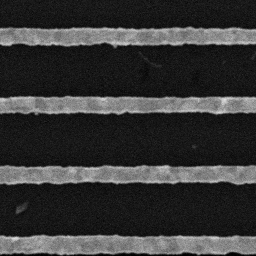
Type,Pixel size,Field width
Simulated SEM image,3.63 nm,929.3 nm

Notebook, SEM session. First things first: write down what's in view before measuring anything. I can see lines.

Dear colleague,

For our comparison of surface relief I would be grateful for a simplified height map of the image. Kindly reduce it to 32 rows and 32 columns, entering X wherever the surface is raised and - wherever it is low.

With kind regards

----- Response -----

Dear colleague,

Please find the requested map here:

--------------------------------
--------------------------------
--------------------------------
--------------------------------
XXXXXXXXXXXXXXXXXXXXXXXXXXXXXXXX
XX-XXXXXXXXX--XXXXXXXXX-XX-XXXX-
--------------------------------
--------------------------------
--------------------------------
--------------------------------
--------------------------------
--------------------------------
XXXXXXXXXXXXXXXXXXXXXXXXXXXXXXXX
XXXXXXXXXXXXXXXXXXXXXXXXXXXXXXXX
--------------------------------
--------------------------------
--------------------------------
--------------------------------
--------------------------------
--------------------------------
--------------------------------
XXXXXXXXXXXXXXXXXXXXXXXXXXXXXXXX
XXXXXXXXXXXXXXXXXXXXXXXXXXXXXXXX
--------------------------------
--------------------------------
--------------------------------
--------------------------------
--------------------------------
--------------------------------
--------------X-----------------
XXXXXXXXXXXXXXXXXXXXXXXXXXXXXXXX
XXXXXXXXXXXXXXXXXXXXXXXXXXXXXXXX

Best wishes